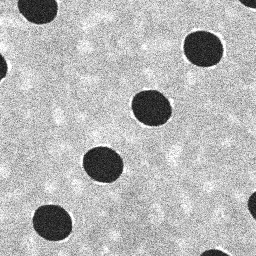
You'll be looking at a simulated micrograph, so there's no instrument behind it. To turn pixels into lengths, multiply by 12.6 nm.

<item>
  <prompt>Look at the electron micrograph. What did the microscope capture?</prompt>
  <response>holes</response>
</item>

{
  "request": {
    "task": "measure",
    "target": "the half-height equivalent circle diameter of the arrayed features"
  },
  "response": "484 nm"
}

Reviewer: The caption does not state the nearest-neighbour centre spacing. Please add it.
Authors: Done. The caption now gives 952 nm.